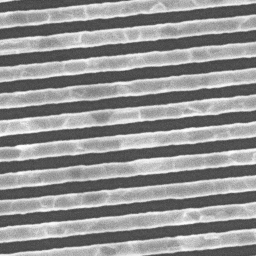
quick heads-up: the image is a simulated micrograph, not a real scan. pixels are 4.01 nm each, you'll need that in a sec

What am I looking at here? parallel lines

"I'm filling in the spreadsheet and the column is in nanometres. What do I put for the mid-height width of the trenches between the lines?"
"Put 47.4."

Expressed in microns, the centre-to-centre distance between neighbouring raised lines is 0.107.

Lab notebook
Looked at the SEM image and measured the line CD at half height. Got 58.4 nm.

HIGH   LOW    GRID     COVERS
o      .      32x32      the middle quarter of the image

ooooooooooooooooooooo.o.........
ooooooooooooooo.................
ooo.............................
........................oooooooo
.................ooooooooooooooo
....oooooooooooo.ooooooooooooooo
ooooooooooooooooooooooooooooooo.
ooooooooooooooooooooo...........
ooooooooooo.....................
...............................o
.......................ooooooooo
..........oo.ooooooooooooooooo..
.o.ooooooooooooooooooooooooooo.o
ooooooooooooooooooooooooooo.....
ooooooooooooooooo...............
oooooooo.o......................
.............................ooo
...................oooooooooooo.
........ooooooooooooooooooooooo.
oooooooooooooooooooooooooooooooo
oooooooooooooooooooooooo........
oooooooooooooo..................
oooo............................
.......................ooooooooo
................oooooooooooooooo
...ooooooooooooooooooooooooooooo
oooooooooooooooooooooooooooooo.o
ooooooooooooooooooooo...........
oooooooooooo....................
................................
.......................ooooooooo
.............ooooooooooooooooooo